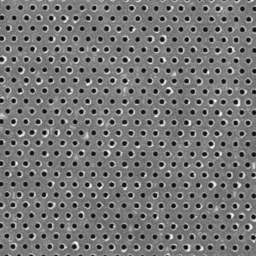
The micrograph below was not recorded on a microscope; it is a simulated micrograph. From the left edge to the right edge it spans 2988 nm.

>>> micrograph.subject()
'a regular array of holes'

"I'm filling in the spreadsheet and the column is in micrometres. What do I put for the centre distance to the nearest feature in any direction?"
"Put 0.139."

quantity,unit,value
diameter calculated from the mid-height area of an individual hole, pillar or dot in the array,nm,55.9